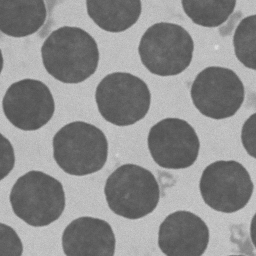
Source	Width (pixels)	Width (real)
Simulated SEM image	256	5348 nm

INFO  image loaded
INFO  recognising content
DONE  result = a regular array of holes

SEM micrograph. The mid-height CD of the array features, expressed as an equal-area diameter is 1.15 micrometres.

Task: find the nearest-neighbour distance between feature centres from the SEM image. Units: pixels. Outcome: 65.6